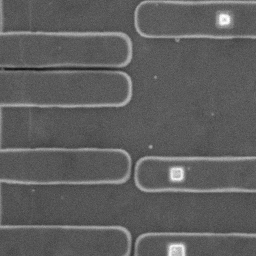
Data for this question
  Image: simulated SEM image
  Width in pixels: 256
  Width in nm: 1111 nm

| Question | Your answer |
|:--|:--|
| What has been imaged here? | wiring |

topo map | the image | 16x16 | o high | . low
.........ooooooo
.........ooooooo
oooooooo........
oooooooo........
oooooooo........
oooooooo........
oooooooo........
................
................
oooooooo........
oooooooooooooooo
.........ooooooo
................
................
oooooooo........
oooooooooooooooo